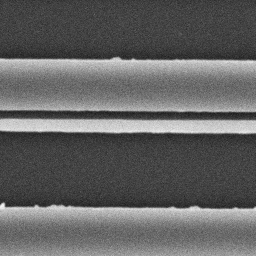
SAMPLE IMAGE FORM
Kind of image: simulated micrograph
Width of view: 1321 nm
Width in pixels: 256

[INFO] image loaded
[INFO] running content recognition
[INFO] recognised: lines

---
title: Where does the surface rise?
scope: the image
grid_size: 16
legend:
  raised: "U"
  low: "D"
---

DDDDDDDDDDDDDDDD
DDDDDDDDDDDDDDDD
DDDDDDDDDDDDDDDD
DDDDDDDDDDDDDDDD
UUUUUUUUUUUUUUUU
UUUUUUUUUUUUUUUU
UUUUUUUUUUUUUUUU
UUUUUUUUUUUUUUUU
DDDDDDDDDDDDDDDD
DDDDDDDDDDDDDDDD
DDDDDDDDDDDDDDDD
DDDDDDDDDDDDDDDD
DDDDDDDDDDDDDDDD
UUUUUUUUUUUUUUUU
UUUUUUUUUUUUUUUU
UUUUUUUUUUUUUUUU